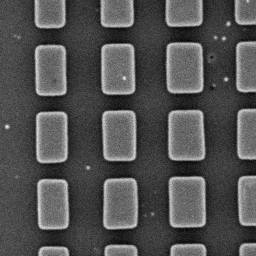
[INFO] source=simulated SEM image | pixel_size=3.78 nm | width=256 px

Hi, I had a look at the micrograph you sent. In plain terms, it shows wiring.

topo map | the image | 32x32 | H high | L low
LLLLHHHHLLLLLHHHHLLLLHHHHLLLLHHH
LLLLHHHHLLLLLHHHHLLLLHHHHLLLLHHH
LLLLHHHHLLLLLHHHHLLLLHHHHLLLLLHH
LLLLLLLLLLLLLLLLLLLLLLLLLLLLLLLL
LLLLLLLLLLLLLLLLLLLLLLLLLLLLLLLL
LLLLLLLLLLLLLLLLLLLLLHHHHLLLLLHH
LLLLHHHHLLLLLHHHHLLLLHHHHLLLLLHH
LLLLHHHHLLLLLHHHHLLLLHHHHLLLLLHH
LLLLLHHHLLLLLHHHHLLLLHHHHLLLLLHH
LLLLLHHHLLLLLHHHHLLLLHHHHLLLLLHH
LLLLLHHHLLLLLHHHHLLLLHHHHLLLLLHH
LLLLLHHHLLLLLHHHHLLLLHHHHLLLLLLL
LLLLLLLLLLLLLLLLLLLLLLLLLLLLLLLL
LLLLLLLLLLLLLLLLLLLLLLLLLLLLLLLL
LLLLLHHHLLLLLHHHHLLLLHHHHLLLLLHH
LLLLLHHHLLLLLHHHHLLLLHHHHLLLLLHH
LLLLLHHHLLLLLHHHHLLLLHHHHLLLLLHH
LLLLLHHHLLLLLHHHHLLLLHHHHLLLLLHH
LLLLLHHHLLLLLHHHHLLLLHHHHHLLLLHH
LLLLLHHHLLLLLHHHHLLLLHHHHLLLLLHH
LLLLLLLLLLLLLLLLLLLLLLLLLLLLLLLL
LLLLLLLLLLLLLLLLLLLLLLLLLLLLLLLL
LLLLLHHHLLLLLLHHHLLLLHHHHLLLLLHH
LLLLLHHHLLLLLHHHHLLLLHHHHHLLLLHH
LLLLLHHHLLLLLHHHHLLLLHHHHHLLLLHH
LLLLLHHHHLLLLHHHHLLLLHHHHHLLLLHH
LLLLLHHHHLLLLHHHHLLLLHHHHHLLLLHH
LLLLLHHHHLLLLHHHHLLLLHHHHHLLLLHH
LLLLLHHHLLLLLHHHLLLLLLLLLLLLLLLL
LLLLLLLLLLLLLLLLLLLLLLLLLLLLLLLL
LLLLLLLLLLLLLLLLLLLLLLLLLLLLLLLH
LLLLLHHHHLLLLHHHHLLLLHHHHHLLLLHH